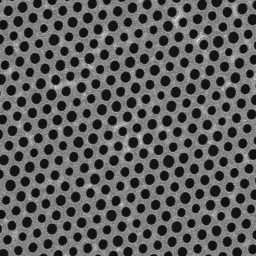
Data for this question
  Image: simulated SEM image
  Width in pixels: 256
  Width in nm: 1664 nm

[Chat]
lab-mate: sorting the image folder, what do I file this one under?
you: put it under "a regular array of holes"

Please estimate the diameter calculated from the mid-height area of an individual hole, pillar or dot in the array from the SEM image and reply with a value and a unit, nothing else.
62.3 nm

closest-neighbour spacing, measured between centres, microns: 0.0962